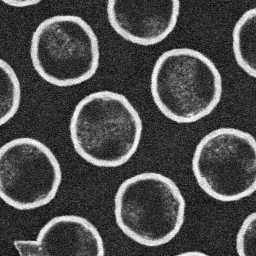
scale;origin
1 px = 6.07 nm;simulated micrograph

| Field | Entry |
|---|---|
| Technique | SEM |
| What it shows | raised bodies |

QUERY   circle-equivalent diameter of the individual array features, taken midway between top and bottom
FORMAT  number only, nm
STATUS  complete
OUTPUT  407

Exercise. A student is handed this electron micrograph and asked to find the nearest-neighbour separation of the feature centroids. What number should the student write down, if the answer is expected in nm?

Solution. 544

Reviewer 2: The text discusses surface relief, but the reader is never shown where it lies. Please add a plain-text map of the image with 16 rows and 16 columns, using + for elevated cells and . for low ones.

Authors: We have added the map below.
.......++++.....
...++..++++....+
..++++...+.....+
..++++....++...+
+..+++....+++...
+.........++++..
+....+++..+++...
.....++++.......
.....++++....++.
+++..+++....++++
++++........++++
++++....+++..+++
.++....++++.....
.......++++.....
...+++..+++....+
..++++.........+